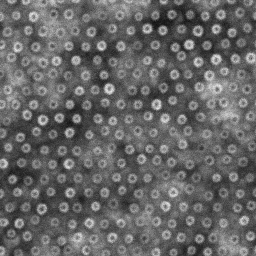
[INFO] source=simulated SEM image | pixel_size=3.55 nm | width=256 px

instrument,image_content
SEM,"a regular array of raised bodies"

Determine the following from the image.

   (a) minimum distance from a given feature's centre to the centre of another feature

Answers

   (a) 0.0524 microns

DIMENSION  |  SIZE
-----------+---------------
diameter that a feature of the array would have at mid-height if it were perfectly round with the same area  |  0.0277 microns